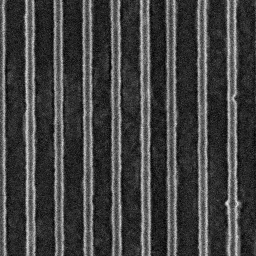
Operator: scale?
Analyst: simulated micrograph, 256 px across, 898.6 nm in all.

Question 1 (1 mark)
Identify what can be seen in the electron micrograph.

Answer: parallel lines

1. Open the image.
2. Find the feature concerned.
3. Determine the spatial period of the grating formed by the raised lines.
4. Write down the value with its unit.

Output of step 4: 28.8 pixels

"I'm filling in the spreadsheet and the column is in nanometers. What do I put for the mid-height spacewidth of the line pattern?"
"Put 75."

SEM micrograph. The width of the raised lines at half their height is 27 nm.